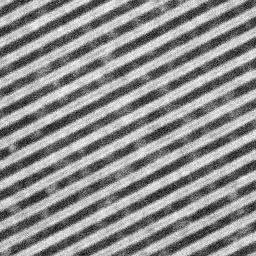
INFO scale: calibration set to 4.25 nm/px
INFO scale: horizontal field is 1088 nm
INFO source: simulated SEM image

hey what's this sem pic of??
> parallel lines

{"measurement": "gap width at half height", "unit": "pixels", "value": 12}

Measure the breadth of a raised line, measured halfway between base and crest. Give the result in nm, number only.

25.4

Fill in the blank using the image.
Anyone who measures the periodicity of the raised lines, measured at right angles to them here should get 76.8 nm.